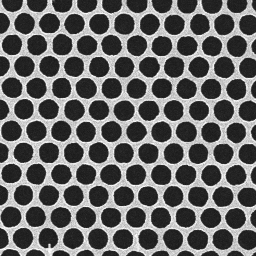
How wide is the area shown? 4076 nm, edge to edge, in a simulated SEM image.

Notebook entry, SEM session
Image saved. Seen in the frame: a regular array of holes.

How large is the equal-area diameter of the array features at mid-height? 328 nm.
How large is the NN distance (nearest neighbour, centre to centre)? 390 nanometres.